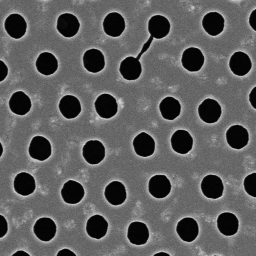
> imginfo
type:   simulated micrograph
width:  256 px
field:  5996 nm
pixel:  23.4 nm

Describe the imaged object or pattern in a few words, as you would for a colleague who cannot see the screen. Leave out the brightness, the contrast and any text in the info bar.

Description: a regular array of holes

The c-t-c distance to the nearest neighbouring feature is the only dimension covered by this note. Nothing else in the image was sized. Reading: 40.8 pixels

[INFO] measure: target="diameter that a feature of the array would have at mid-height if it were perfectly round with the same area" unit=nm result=549